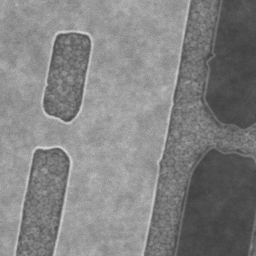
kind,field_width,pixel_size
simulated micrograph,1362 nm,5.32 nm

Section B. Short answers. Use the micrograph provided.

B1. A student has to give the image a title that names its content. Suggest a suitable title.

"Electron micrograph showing one or a few lines or trenches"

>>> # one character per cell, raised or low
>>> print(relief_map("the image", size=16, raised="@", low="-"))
@@@@@@@@@@@@--@@
@@@@@@@@@@@@--@@
@@@---@@@@@--@@@
@@@---@@@@@--@@@
@@@---@@@@@--@@@
@@@--@@@@@@--@@@
@@@--@@@@@@--@@@
@@@@@@@@@@@---@@
@@@@@@@@@@------
@@--@@@@@@---@--
@@--@@@@@@--@@@@
@@--@@@@@@--@@@@
@---@@@@@@--@@@@
@---@@@@@--@@@@@
@---@@@@@--@@@@@
@--@@@@@@--@@@@@